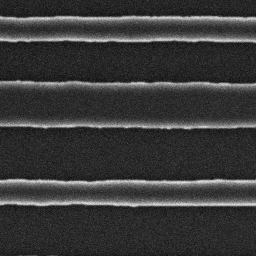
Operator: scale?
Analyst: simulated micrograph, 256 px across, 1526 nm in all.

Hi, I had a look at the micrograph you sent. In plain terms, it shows lines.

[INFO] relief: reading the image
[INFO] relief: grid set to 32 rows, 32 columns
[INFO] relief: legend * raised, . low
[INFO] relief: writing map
................................
................................
********************************
********************************
********************************
................................
................................
................................
................................
................................
*****************************..*
********************************
********************************
********************************
********************************
********************************
................................
................................
................................
................................
................................
................................
.**........................*....
********************************
********************************
*.*******..*********************
................................
................................
................................
................................
................................
................................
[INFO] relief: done